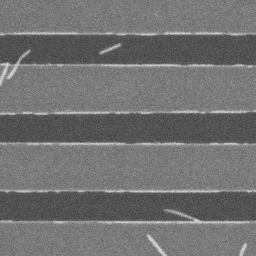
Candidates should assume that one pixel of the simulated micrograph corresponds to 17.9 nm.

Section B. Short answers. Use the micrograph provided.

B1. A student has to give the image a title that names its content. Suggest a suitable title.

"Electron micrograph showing lines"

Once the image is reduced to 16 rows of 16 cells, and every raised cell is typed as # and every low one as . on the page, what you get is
################
################
................
................
################
################
################
................
................
################
################
################
................
................
################
################